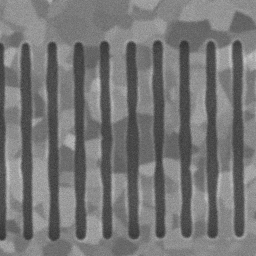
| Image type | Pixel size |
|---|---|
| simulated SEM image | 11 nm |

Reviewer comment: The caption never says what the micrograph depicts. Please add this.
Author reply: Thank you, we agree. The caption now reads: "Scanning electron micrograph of groups of lines, slits or small figures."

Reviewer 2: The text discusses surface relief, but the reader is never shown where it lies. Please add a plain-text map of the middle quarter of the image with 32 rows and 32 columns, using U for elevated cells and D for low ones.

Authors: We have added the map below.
UUDDDUUUDDDDUUUDDDUUUUDDDUUUUDDD
UUDDDUUUDDDDUUUDDDUUUUDDDUUUUDDD
UUDDDUUUDDDDUUUDDDDUUUDDDUUUUDDD
UUDDDUUUDDDUUUUUDDDUUUDDDUUUUDDD
UUDDDUUUUDDUUUUUDDDUUUDDDUUUUDDD
UUDDDUUUUDDUUUUUDDDUUUDDDUUUUDDD
UUDDDUUUUDDUUUUUDDDUUUDDDUUUUDDD
UUDDDUUUUDDDUUUUDDDUUUDDDUUUUDDD
UUDDDUUUUDDDUUUUDDDUUUDDDUUUUDDD
UUDDDUUUUDDDUUUUDDDUUUDDDUUUUDDD
UUDDDUUUUDDDUUUUDDUUUUDDDUUUUDDD
UUUDDUUUUDDDUUUUDDUUUUDDDUUUUDDD
UUUDDUUUUDDDUUUUDDUUUUDDDUUUUDDD
UUUDDUUUUDDDUUUUDDUUUUDDDUUUUDDD
UUDDDUUUUDDDUUUUDDUUUUDDDUUUUDDD
UUUDDUUUUDDDUUUUDDDUUUDDDUUUUDDD
UUUDDUUUUDDDUUUUDDDUUUDDDUUUUDDD
UUUDDUUUUDDDUUUUDDDUUUDDDUUUUDDD
UUUDDUUUUDDDUUUDDDDUUUDDDUUUUDDD
UUUDDUUUUDDDUUUDDDDUUUDDDUUUDDDD
UUUDDUUUUDDDUUUDDDDUUUDDDUUUUDDD
UUUDDDUUUDDDUUUUDDDUUUDDDUUUUDDD
UUDDDDUUUDDDUUUUDDDUUUUDDUUUUDDD
UUDDDDUUUDDDUUUUDDDUUUUDDUUUUDDD
UUDDDDUUUDDDUUUUDDDUUUUDDUUUUDDD
UUDDDDUUUDDDUUUUDDDUUUUDDUUUUDDD
UUDDDDUUUDDDUUUUDDDUUUUDDUUUUDDD
UUDDDDUUUDDDUUUUDDDUUUDDDUUUUDDD
UUDDDDUUUDDDUUUUDDDUUUDDDUUUUDDD
UUDDDDUUUDDDUUUUDDDUUUDDDUUUUDDD
UUUDDDUUUDDDUUUUDDDUUUDDDUUUUDDD
UUUDDDUUUDDDUUUUDDDUUUDDDUUUUDDD